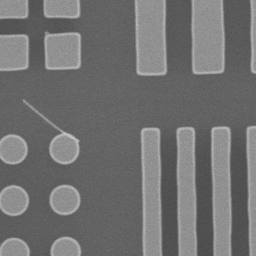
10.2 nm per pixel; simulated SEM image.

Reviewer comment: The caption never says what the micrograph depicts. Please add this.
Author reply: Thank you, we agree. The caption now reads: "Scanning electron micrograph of groups of lines, slits or small figures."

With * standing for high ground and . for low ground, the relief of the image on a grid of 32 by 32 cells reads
***...****.......****...****...*
***...****.......****...****...*
.................****...****...*
.................****...****...*
***...****.......****...****...*
***...****.......****...****...*
***...****.......****...****...*
***...****.......****...****...*
***...****.......****...****...*
................................
................................
................................
................................
................................
................................
................................
..................**..**...**..*
***....***........**..**...**..*
***...****........**..**...**..*
***...****........**..**...**..*
..................**..**...**..*
..................**..**...**..*
..................**..**...**..*
.**....**.........**..**...**..*
***...****........**..**...**..*
***...****........**..**...**..*
.**....**.........**..**...**..*
..................**..**...**..*
..................**..**...**..*
..................**..***..**..*
***....***........**..***..**..*
****..****........**..***..**..*